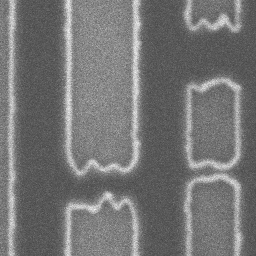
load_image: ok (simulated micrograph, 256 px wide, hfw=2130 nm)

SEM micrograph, one or a few lines or trenches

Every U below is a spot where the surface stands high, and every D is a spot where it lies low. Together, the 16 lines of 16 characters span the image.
DUUUDDDDUUUUDDDU
DUUUDDDDUUUUUUUU
DUUUDDDDUUUUUUUU
DUUUDDDDUUUUUUUU
DUUUDDDDUUUUUUUU
DUUUDDDDUUUUUDUU
DUUUDDDDUUUUDDDU
DUUUDDDDUUUUDDDU
DUUUDDDDUUUUDDDU
DUUUDDDDUUUUDDDU
DUUUUUUUUUUUUUUU
DUUUUUUUUUUUDDUU
DUUUUUUUUUUUDDDU
DUUUDDDDUUUUDDDU
DUUUDDDDUUUUDDDU
DUUUDDDDUUUUDDDU